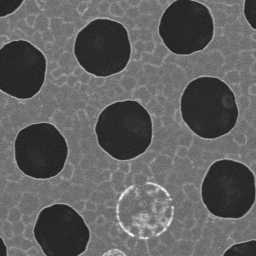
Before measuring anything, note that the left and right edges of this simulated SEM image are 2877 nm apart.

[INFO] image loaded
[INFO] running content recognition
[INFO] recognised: holes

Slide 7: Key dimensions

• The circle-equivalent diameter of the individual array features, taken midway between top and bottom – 648 nanometres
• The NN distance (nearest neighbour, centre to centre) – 0.963 um